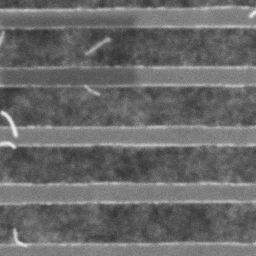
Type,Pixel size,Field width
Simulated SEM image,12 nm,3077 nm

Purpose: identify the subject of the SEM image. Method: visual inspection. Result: lines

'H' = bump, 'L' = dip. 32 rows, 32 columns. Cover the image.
LLLLLLLLLLLLLLLLLLLLLLLLLLLLLLLL
HHHHHHHHHHHHHHHHHHHHHHHHHHHHHHHH
HHHHHHHHHHHHHHHHHHHHHHHHHHHHHHHH
LHLHHLLLLLLLLLLLLLLLLLLLLLLLLLLL
LLLLLLLLLLLLLLLLLLLLLLLLLLLLLLLL
LLLLLLLLLLLLLLLLLLLLLLLLLLLLLLLL
LLLLLLLLLLLLLLLLLLLLLLLLLLLLLLLL
LLLLLLLLLLLLLLLLLLLLLLLLLLLLLLLL
LLLLHHHHHHHHHHHHHHHHHHHHHHHHHHHH
HHHHHHHHHHHHHHHHHHHHHHHHHHHHHHHH
HHHHHHHHHHHHHHHHHHHHHHHHHHHHHHHH
LLLLLLLLLLLLLLLLLLLLLLLLLLLLLLLL
LLLLLLLLLLLLLLLLLLLLLLLLLLLLLLLL
LLLLLLLLLLLLLLLLLLLLLLLLLLLLLLLL
LLLLLLLLLLLLLLLLLLLLLLLLLLLLLLLL
LLLLLLLLLLLLLLLLLLLLLLLLLLLLLLLL
HHHHHHHHHHHHHHHHHHHHHHHHHHHHHHHH
HHHHHHHHHHHHHHHHHHHHHHHHHHHHHHHH
LLLLLLLLLLLLLLLLLLLLLLLLLLLLLLLL
LLLLLLLLLLLLLLLLLLLLLLLLLLLLLLLL
LLLLLLLLLLLLLLLLLLLLLLLLLLLLLLLL
LLLLLLLLLLLLLLLLLLLLLLLLLLLLLLLL
LLLLLLLLLLLLLLLLLLLLLLLLLLLLLLLL
HHHHHHHHHHHHHHHHHHHHHHHHHHHHHHHH
HHHHHHHHHHHHHHHHHHHHHHHHHHHHHHHH
LLLLLLLLLLLLLLLLLLLLLLLLLLLLLLLL
LLLLLLLLLLLLLLLLLLLLLLLLLLLLLLLL
LLLLLLLLLLLLLLLLLLLLLLLLLLLLLLLL
LLLLLLLLLLLLLLLLLLLLLLLLLLLLLLLL
LLLLLLLLLLLLLLLLLLLLLLLLLLLLLLLL
LLHLLLLLLLLLLLLLLLLLHHHHHHHHHHLH
HHHHHHHHHHHHHHHHHHHHHHHHHHHHHHHH